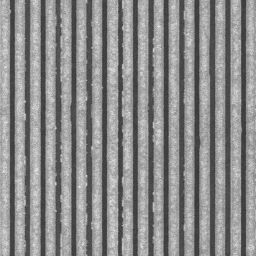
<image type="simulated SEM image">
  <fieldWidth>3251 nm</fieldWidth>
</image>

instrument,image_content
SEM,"parallel lines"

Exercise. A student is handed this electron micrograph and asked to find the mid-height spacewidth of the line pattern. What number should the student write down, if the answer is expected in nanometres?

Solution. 63.5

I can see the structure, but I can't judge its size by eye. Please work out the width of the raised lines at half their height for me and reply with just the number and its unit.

0.125 µm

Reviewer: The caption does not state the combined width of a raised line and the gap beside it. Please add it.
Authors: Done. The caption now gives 0.196 microns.